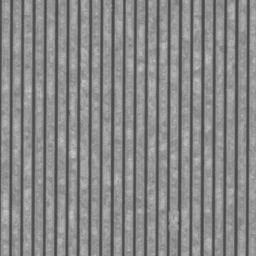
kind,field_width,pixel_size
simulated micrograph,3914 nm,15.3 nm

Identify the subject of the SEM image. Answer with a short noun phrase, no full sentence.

parallel lines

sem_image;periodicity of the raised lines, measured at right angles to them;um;0.172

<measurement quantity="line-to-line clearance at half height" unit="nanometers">63.1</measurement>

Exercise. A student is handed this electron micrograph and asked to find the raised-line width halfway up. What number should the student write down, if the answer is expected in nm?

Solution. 115